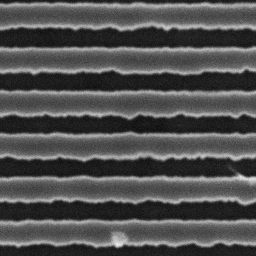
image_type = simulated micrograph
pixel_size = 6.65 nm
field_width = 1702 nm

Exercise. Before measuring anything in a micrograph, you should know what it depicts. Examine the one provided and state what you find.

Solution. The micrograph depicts lines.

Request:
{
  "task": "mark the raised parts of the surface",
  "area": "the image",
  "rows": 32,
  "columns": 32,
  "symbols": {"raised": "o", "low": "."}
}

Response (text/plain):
.....o.o........................
oooooooooooooooooooooooooooooooo
oooooooooooooooooooooooooooooooo
o........o.oo.ooo...o.oo.ooooooo
................................
................................
oooooooooooooooooooooooooooooooo
oooooooooooooooooooooooooooooooo
oooooooooooooooooooooooooooooooo
................................
................................
o.ooo............oo.............
oooooooooooooooooooooooooooooooo
oooooooooooooooooooooooooooooooo
...o...o....o..oo..ooo..o....o.o
................................
................................
oooooooooooooooooooooooooooooooo
oooooooooooooooooooooooooooooooo
oooooooooooooooooooooooooooooooo
................................
................................
oooooooooooooooooooooooooooooooo
oooooooooooooooooooooooooooooooo
oooooooooooooooooooooooooooooooo
................................
................................
................................
oooooooooooooooooooooooooooooooo
oooooooooooooooooooooooooooooooo
oooo..ooo..ooooooo.o.oo..oo.o.oo
................................